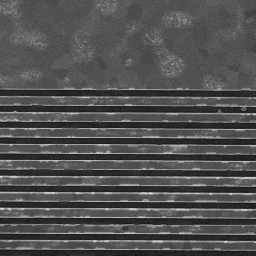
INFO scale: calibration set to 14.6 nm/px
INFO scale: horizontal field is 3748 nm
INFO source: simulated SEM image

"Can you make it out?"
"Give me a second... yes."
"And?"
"parallel lines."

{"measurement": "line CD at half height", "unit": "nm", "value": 117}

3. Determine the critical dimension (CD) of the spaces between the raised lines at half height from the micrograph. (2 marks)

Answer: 0.117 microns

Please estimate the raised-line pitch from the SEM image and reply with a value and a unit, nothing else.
234 nm